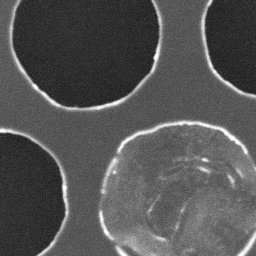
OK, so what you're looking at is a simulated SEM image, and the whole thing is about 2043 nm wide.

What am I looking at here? holes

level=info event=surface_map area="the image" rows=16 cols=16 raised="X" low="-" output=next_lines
X---------XXX---
X---------XXX---
X---------XXX---
X---------XXX---
XX-------XXXXX--
XX------XXXXXXX-
XXXX---XXXXXXXXX
XXXXXXXXXXXXXXXX
--XXXXXXXXXXXXXX
---XXXXXXXXXXXXX
----XXXXXXXXXXXX
----XXXXXXXXXXXX
----XXXXXXXXXXXX
----XXXXXXXXXXXX
----XXXXXXXXXXXX
---XXXXXXXXXXXXX